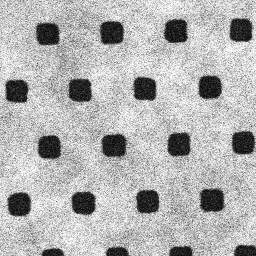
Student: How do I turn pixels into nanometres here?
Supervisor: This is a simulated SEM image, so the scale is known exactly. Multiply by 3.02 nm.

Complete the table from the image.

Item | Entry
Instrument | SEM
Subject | a regular array of holes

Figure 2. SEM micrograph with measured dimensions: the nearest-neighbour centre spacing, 0.194 µm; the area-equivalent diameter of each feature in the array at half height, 73.8 nm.